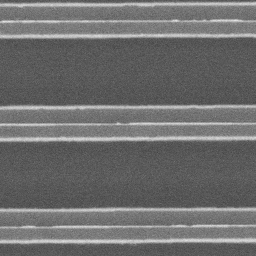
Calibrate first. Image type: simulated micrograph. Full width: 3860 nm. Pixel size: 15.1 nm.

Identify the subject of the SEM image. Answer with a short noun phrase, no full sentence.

lines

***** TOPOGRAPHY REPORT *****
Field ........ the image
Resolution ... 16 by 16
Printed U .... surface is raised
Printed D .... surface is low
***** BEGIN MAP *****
UUUUUUUUUUUUUUUU
UUUUUUUUUUUUUUUU
DDDDDDDDDDDDDDDD
DDDDDDDDDDDDDDDD
DDDDDDDDDDDDDDDD
DDDDDDDDDDDDDDDD
DDDDDDDDDDDDDDDD
UUUUUUUUUUUUUUUU
UUUUUUUUUUUUUUUU
DDDDDDDDDDDDDDDD
DDDDDDDDDDDDDDDD
DDDDDDDDDDDDDDDD
DDDDDDDDDDDDDDDD
UUUUUUUUUUUUUUUU
UUUUUUUUUUUUUUUU
DDDDDDDDDDDDDDDD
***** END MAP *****